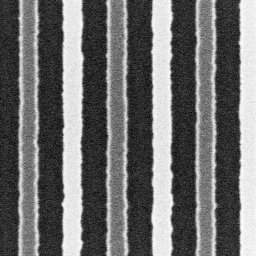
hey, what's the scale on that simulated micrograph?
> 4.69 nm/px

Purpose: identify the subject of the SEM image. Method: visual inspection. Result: lines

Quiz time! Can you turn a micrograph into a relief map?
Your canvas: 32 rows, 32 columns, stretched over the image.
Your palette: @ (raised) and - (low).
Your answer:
---@@---@@---@@@---@@----@@---@@
---@@---@@---@@@---@@----@@---@@
--@@@---@@---@@@---@@----@@---@@
---@@---@@---@@@---@@----@@---@@
--@@@---@@---@@@---@@----@@---@@
---@@---@@---@@@---@@----@@---@@
---@@---@@---@@@---@@----@@---@@
---@@---@@---@@@---@@----@@---@@
---@@---@@---@@@---@@----@@---@@
--@@@---@@---@@@---@@----@@---@@
--@@@---@@---@@@---@@----@@---@@
---@@---@@---@@@---@@----@@---@@
---@@---@@---@@@---@@----@@---@@
---@@---@@---@@@---@@----@@---@@
--@@@---@@---@@@---@@----@@---@@
--@@@---@@---@@@---@@----@@---@@
--@@@---@@---@@@---@@----@@---@@
--@@@---@@---@@@---@@----@@---@@
--@@@---@@---@@@---@@----@@---@@
--@@@---@@---@@@---@@----@@---@@
--@@@---@@---@@@---@@----@@---@@
---@@---@@---@@@---@@----@@---@@
--@@@---@@---@@@---@@----@@---@@
--@@@---@@---@@@---@@----@@---@@
---@@---@@---@@@---@@----@@---@@
--@@@---@@---@@@---@@@---@@---@@
--@@@---@@---@@@---@@----@@---@@
---@@---@@---@@@---@@----@@---@@
--@@@---@@---@@@---@@----@@---@@
--@@@---@@---@@@---@@----@@---@@
--@@@---@@---@@@---@@----@@---@@
--@@@---@@---@@@---@@----@@---@@